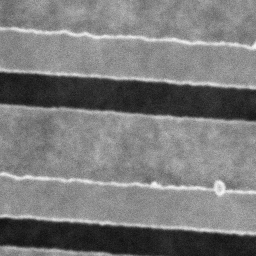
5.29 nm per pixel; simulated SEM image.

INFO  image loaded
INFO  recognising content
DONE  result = lines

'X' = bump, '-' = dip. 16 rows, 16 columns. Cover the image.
XXXXXXXXXXXXXXXX
XXXXXXXXXXXXXXXX
XXXXXXXXXXXXXXXX
XXXXXXXXXXXXXXXX
-XXXXXXXXXXXXXXX
---------------X
----------------
XXXXXXXXXXXXXX--
XXXXXXXXXXXXXXXX
XXXXXXXXXXXXXXXX
XXXXXXXXXXXXXXXX
XXXXXXXXXXXXXXXX
XXXXXXXXXXXXXXXX
XXXXXXXXXXXXXXXX
-------------XXX
X---------------